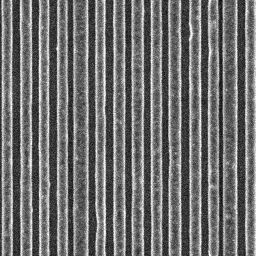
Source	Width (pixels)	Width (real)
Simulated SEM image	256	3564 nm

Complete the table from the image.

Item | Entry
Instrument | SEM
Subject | parallel lines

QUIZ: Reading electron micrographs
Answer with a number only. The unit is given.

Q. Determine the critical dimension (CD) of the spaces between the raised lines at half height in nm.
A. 106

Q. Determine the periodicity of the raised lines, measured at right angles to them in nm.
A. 259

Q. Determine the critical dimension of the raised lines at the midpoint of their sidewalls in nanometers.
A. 146